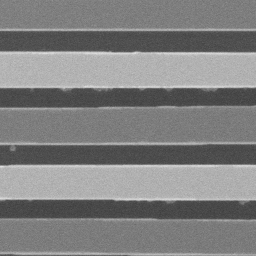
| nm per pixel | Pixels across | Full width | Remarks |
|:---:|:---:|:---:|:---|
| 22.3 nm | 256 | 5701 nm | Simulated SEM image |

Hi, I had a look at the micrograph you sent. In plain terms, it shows lines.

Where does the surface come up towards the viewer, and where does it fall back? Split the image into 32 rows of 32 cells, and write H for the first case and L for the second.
HHHHHHHHHHHHHHHHHHHHHHHHHHHHHHHH
HHHHHHHHHHHHHHHHHHHHHHHHHHHHHHHH
HHHHHHHHHHHHHHHHHHHHHHHHHHHHHHHH
HHHHHHHHHHHHHHHHHHHHHHHHHHHHHHHH
LLLLLLLLLLLLLLLLLLLLLLLLLLLLLLLL
LLLLLLLLLLLLLLLLLLLLLLLLLLLLLLLL
LLLLLLLLLLLLLLLLLLLLLLLLLLLLLLLL
HHHHHHHHHHHHHHHHHHHHHHHHHHHHHHHH
HHHHHHHHHHHHHHHHHHHHHHHHHHHHHHHH
HHHHHHHHHHHHHHHHHHHHHHHHHHHHHHHH
HHHHHHHHHHHHHHHHHHHHHHHHHHHHHHHH
LLLLLLLLLLLLLLLLLLLLLLLLLLLLLLLL
LLLLLLLLLLLLLLLLLLLLLLLLLLLLLLLL
LLLLLLLLLLLLHHHHHHHHHHHHHHHHHHHH
HHHHHHHHHHHHHHHHHHHHHHHHHHHHHHHH
HHHHHHHHHHHHHHHHHHHHHHHHHHHHHHHH
HHHHHHHHHHHHHHHHHHHHHHHHHHHHHHHH
HHHHHHHHHHHHHHHHHHHHHHHHHHHHHHHH
LLLLLLLLLLLLLLLLLLLLLLLLLLLLLLLL
LLLLLLLLLLLLLLLLLLLLLLLLLLLLLLLL
LLLLLLLLLLLLLLLLLLLLLLLLLLLLLLLL
HHHHHHHHHHHHHHHHHHHHHHHHHHHHHHHH
HHHHHHHHHHHHHHHHHHHHHHHHHHHHHHHH
HHHHHHHHHHHHHHHHHHHHHHHHHHHHHHHH
HHHHHHHHHHHHHHHHHHHHHHHHHHHHHHHH
LLLLLLLLLLLLLLLLLLLLLLLLLLLLLLLL
LLLLLLLLLLLLLLLLLLLLLLLLLLLLLLLL
HHHHHHHHHHHHHHHHHHHHLLLLLLLLLLLL
HHHHHHHHHHHHHHHHHHHHHHHHHHHHHHHH
HHHHHHHHHHHHHHHHHHHHHHHHHHHHHHHH
HHHHHHHHHHHHHHHHHHHHHHHHHHHHHHHH
HHHHHHHHHHHHHHHHHHHHHHHHHHHHHHHH